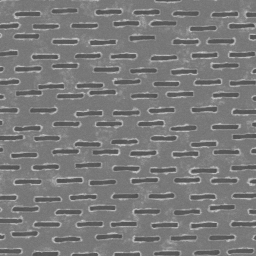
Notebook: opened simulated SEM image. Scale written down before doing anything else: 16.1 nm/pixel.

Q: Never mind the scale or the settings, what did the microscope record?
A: a regular array of holes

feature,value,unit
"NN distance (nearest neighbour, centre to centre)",347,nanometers